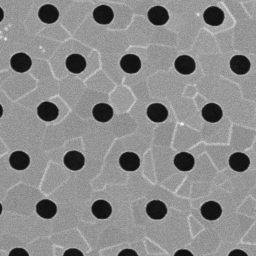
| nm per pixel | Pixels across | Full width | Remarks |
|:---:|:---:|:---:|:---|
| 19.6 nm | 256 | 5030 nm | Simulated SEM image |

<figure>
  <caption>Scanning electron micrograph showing a regular array of holes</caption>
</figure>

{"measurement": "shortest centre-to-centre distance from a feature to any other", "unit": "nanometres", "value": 1080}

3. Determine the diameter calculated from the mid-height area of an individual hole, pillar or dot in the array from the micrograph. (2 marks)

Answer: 403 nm